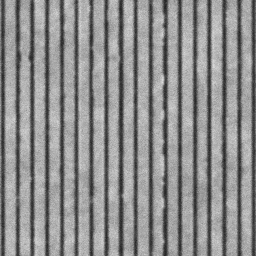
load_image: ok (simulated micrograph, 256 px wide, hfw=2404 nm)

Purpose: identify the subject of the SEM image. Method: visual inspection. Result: parallel lines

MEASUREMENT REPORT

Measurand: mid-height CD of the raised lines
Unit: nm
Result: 91.6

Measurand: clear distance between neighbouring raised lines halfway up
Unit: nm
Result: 49.3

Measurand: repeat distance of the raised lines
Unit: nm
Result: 139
